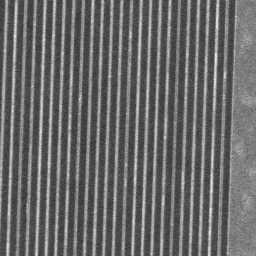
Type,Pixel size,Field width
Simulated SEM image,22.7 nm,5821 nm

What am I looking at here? parallel lines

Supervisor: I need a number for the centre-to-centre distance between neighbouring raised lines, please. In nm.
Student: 218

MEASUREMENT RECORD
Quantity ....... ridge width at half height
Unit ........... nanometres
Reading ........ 42.6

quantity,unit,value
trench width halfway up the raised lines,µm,0.171